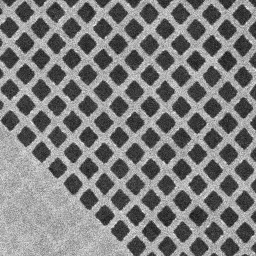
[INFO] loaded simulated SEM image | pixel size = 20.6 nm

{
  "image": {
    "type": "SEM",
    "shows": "a regular array of holes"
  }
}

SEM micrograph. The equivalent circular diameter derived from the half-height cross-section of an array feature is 0.383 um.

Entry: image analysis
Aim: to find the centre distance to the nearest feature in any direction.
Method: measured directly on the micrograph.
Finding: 446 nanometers